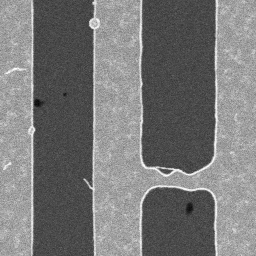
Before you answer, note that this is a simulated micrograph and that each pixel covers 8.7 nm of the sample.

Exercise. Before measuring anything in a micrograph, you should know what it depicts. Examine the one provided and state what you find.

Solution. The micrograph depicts one or a few lines or trenches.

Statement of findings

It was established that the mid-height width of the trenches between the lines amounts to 548 nm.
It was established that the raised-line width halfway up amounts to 411 nanometres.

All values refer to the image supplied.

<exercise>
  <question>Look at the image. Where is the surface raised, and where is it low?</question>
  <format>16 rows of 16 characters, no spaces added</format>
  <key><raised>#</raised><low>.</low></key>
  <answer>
##....###.....##
##....###.....##
##....###.....##
##....###....###
##....###....###
##....###.....##
##....###.....##
##....###.....##
##....###....###
##....###....###
##....###....###
##....##########
##....###....###
##....###....###
##....###....###
##....###.....##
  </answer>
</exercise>